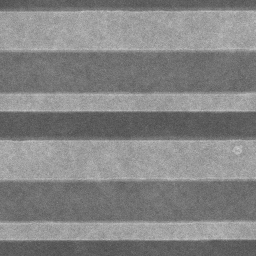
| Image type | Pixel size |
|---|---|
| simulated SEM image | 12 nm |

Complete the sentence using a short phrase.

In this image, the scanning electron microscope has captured lines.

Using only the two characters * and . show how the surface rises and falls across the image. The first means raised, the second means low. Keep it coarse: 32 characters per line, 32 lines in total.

................................
********************************
********************************
********************************
********************************
********************************
................................
................................
................................
................................
................................
................................
********************************
********************************
................................
................................
................................
.....................*......****
********************************
********************************
********************************
********************************
................................
................................
................................
................................
................................
................................
********************************
********************************
................................
................................